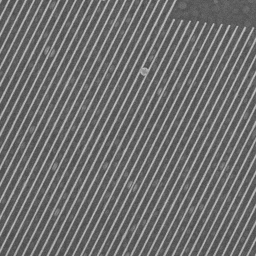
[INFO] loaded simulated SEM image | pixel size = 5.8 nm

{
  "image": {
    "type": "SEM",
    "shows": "parallel lines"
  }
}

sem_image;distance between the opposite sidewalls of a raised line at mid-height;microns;0.0084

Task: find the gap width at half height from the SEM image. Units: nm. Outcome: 35.7